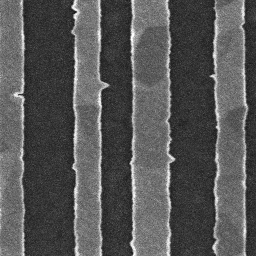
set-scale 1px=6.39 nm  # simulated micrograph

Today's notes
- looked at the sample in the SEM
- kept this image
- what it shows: one or a few lines or trenches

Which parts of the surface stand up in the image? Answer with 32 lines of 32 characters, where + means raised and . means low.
+++......++++....++++......++++.
+++......++++....++++......+++++
+++......++++....++++......++++.
+++......++++....++++......+++..
+++......++++...+++++......++++.
+++......++++...+++++......++++.
+++......+++.....++++......++++.
+++......+++....+++++......++++.
+++......+++.....++++......++++.
+++......+++.....++++......++++.
+++......++++....++++......++++.
+++......++++....++++......++++.
+++......++++....++++......++++.
+++......++++....++++......++++.
+++......++++....++++......++++.
+++......++++....++++......++++.
+++......++++....++++......++++.
+++......++++....++++......++++.
+++......++++....++++......++++.
+++......++++....++++......++++.
+++......++++...+++++......++++.
+++......++++...+++++......++++.
+++.......++.....++++......++++.
+++......++++....++++......++++.
+++......++++....++++......++++.
+++......++++....++++......++++.
+++......++++....++++......++++.
+++......++++....++++......++++.
+++......++++....++++......++++.
+++......++++....++++......++++.
+++......++++...+++++......++++.
+++......++++....++++......++++.